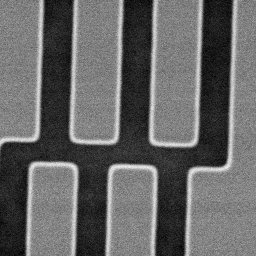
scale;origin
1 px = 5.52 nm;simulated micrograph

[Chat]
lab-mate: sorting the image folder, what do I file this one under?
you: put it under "groups of lines, slits or small figures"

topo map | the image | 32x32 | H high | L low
HHHHHLLLLHHHHHHLLLLHHHHHHLLLLHHH
HHHHHLLLLHHHHHHLLLLHHHHHHLLLLHHH
HHHHHLLLLHHHHHHLLLLHHHHHHLLLLHHH
HHHHHLLLLHHHHHHLLLLHHHHHHLLLLHHH
HHHHHLLLLHHHHHHLLLLHHHHHHLLLLHHH
HHHHHLLLLHHHHHHLLLLHHHHHHLLLLHHH
HHHHHLLLLHHHHHHLLLLHHHHHHLLLLHHH
HHHHHLLLLHHHHHHLLLLHHHHHHLLLLHHH
HHHHHLLLLHHHHHHLLLLHHHHHHLLLLHHH
HHHHHLLLLHHHHHHLLLLHHHHHHLLLLHHH
HHHHHLLLLHHHHHHLLLLHHHHHHLLLLHHH
HHHHHLLLLHHHHHHLLLLHHHHHHLLLLHHH
HHHHHLLLLHHHHHHLLLLHHHHHHLLLLHHH
HHHHHLLLLHHHHHHLLLLHHHHHHLLLLHHH
HHHHHLLLLHHHHHHLLLLHHHHHHLLLLHHH
HHHHHLLLLHHHHHHLLLLHHHHHHLLLLHHH
HHHHHLLLLHHHHHHLLLLHHHHHHLLLLHHH
HHHHLLLLLHHHHHHLLLLHHHHHHLLLLHHH
LLLLLLLLLLLLLLLLLLLLLLLLLLLLLHHH
LLLLLLLLLLLLLLLLLLLLLLLLLLLLLHHH
LLLLHHHHHLLLLLLLLLLLLLLLLLLLHHHH
LLLLHHHHHHLLLLHHHHHLLLLLHHHHHHHH
LLLLHHHHHHLLLLHHHHHLLLLLHHHHHHHH
LLLLHHHHHHLLLLHHHHHLLLLLHHHHHHHH
LLLLHHHHHHLLLLHHHHHLLLLHHHHHHHHH
LLLLHHHHHLLLLLHHHHHLLLLHHHHHHHHH
LLLLHHHHHLLLLHHHHHHLLLLHHHHHHHHH
LLLLHHHHHLLLLHHHHHHLLLLHHHHHHHHH
LLLHHHHHHLLLLHHHHHHLLLLHHHHHHHHH
LLLHHHHHHLLLLHHHHHHLLLLHHHHHHHHH
LLLHHHHHHLLLLHHHHHHLLLLHHHHHHHHH
LLLHHHHHHLLLLHHHHHHLLLLHHHHHHHHH